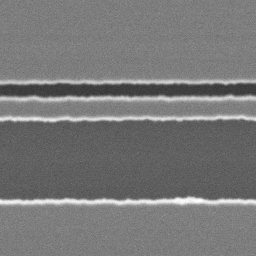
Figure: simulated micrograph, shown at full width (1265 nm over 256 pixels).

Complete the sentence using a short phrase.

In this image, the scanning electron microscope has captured lines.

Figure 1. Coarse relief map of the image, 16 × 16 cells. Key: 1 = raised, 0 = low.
1111111111111111
1111111111111111
1111111111111111
1111111111111111
1111111111111111
1111111111111111
1111111111111111
0011000000000000
0000000000000000
0000000000000000
0000000000000000
0000000000000000
0000000000011000
1111111111111111
1111111111111111
1111111111111111